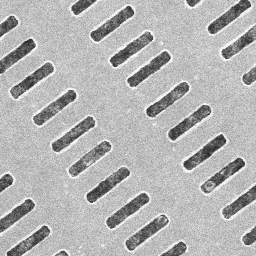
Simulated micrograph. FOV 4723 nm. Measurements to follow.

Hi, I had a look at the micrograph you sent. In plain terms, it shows a regular array of holes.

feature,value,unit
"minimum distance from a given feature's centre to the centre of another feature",550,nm